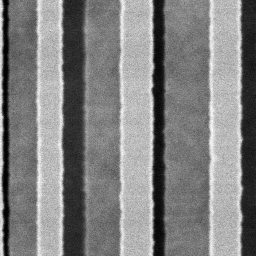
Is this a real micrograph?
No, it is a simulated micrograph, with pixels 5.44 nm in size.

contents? lines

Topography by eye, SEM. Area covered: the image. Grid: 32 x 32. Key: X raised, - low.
-XXXXXXX---XXXXXXXX--XXXXXXXXX--
-XXXXXXX---XXXXXXXX--XXXXXXXXX--
-XXXXXXX---XXXXXXXX--XXXXXXXXX--
-XXXXXXX---XXXXXXXX--XXXXXXXXX--
-XXXXXXX---XXXXXXXX--XXXXXXXXX--
-XXXXXXX---XXXXXXXX--XXXXXXXXX--
-XXXXXXX---XXXXXXXX--XXXXXXXXX--
-XXXXXXX---XXXXXXXX--XXXXXXXXX--
-XXXXXXX---XXXXXXXX--XXXXXXXXX--
-XXXXXXX---XXXXXXXX--XXXXXXXXX--
-XXXXXXX---XXXXXXXX--XXXXXXXXX--
-XXXXXXX---XXXXXXXX--XXXXXXXXX--
-XXXXXXX---XXXXXXXX--XXXXXXXXX--
-XXXXXXX---XXXXXXXX--XXXXXXXXX--
-XXXXXXX---XXXXXXXX--XXXXXXXXX--
-XXXXXXX---XXXXXXXX--XXXXXXXXX--
-XXXXXXX---XXXXXXXX--XXXXXXXXX--
-XXXXXXX---XXXXXXXX--XXXXXXXXX--
-XXXXXXX---XXXXXXXX--XXXXXXXXX--
-XXXXXXX---XXXXXXXX--XXXXXXXXX--
-XXXXXXX---XXXXXXXX--XXXXXXXXX--
-XXXXXXX---XXXXXXXX--XXXXXXXXX--
-XXXXXXX---XXXXXXXX--XXXXXXXXX--
-XXXXXXX---XXXXXXXX--XXXXXXXXX--
-XXXXXXX---XXXXXXXX--XXXXXXXXX--
-XXXXXXX---XXXXXXXX--XXXXXXXXX--
-XXXXXXX---XXXXXXXX--XXXXXXXXX--
-XXXXXXX---XXXXXXXX--XXXXXXXXX--
-XXXXXXX---XXXXXXXX--XXXXXXXXX--
-XXXXXXX---XXXXXXXX--XXXXXXXXX--
-XXXXXXX---XXXXXXXX--XXXXXXXXX--
-XXXXXXX---XXXXXXXX--XXXXXXXXX--